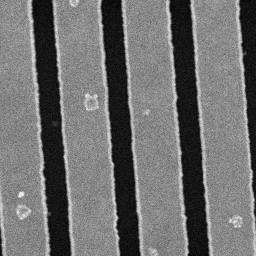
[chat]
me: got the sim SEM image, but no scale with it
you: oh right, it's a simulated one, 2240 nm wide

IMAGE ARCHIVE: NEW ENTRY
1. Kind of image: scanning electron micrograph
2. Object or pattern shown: lines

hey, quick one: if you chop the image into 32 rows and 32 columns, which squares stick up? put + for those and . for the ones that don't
++++...++++++..++++++...++++++..
++++...++++++..++++++...++++++..
++++...++++++..++++++...++++++..
++++...++++++..++++++...++++++..
++++...++++++..++++++...++++++..
++++...++++++...++++++..++++++..
++++...++++++...++++++..++++++..
++++...++++++...++++++..++++++..
+++++..++++++...++++++..+++++++.
+++++..++++++...++++++..+++++++.
+++++..++++++...++++++...++++++.
+++++..++++++...++++++...++++++.
+++++...+++++...++++++...++++++.
+++++...+++++...++++++...++++++.
+++++...++++++..++++++...++++++.
+++++...++++++..++++++...++++++.
+++++...++++++..++++++...++++++.
+++++...++++++..++++++...++++++.
+++++...++++++..+++++++..++++++.
+++++...++++++...++++++..++++++.
++++++..++++++...++++++..++++++.
+++++...++++++...++++++..+++++++
++++++..++++++...++++++..+++++++
++++++..++++++...++++++...++++++
++++++..++++++...++++++...++++++
++++++...+++++...++++++...++++++
++++++...++++++..++++++...++++++
++++++...++++++..++++++...++++++
++++++...++++++..++++++...++++++
++++++...++++++..++++++...++++++
++++++...++++++..++++++...++++++
++++++...++++++..+++++++..++++++